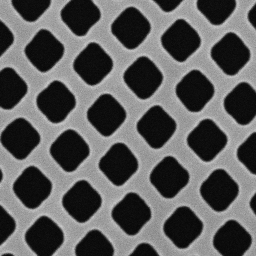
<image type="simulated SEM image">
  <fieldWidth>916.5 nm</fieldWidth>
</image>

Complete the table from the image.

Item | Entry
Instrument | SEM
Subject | a regular array of holes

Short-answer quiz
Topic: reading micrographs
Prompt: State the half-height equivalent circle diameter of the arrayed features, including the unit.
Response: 38.6 px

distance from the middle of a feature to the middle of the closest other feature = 182 nanometres